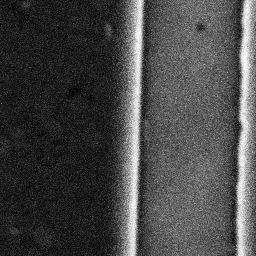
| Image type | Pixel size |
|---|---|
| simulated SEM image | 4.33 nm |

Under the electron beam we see one or a few lines or trenches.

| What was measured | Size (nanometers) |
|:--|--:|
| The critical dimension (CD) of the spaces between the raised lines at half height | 449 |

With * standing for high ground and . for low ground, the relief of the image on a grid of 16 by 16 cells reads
*********......*
*********......*
*********......*
*********......*
*********......*
*********......*
*********......*
*********......*
*********......*
*********......*
********.......*
********.......*
********.......*
********.......*
********.......*
********.......*